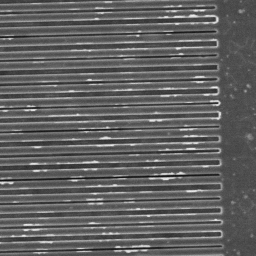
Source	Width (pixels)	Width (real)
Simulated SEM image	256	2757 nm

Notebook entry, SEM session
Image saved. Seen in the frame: parallel lines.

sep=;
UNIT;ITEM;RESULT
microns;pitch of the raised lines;0.129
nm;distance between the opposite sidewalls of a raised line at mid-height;84.8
